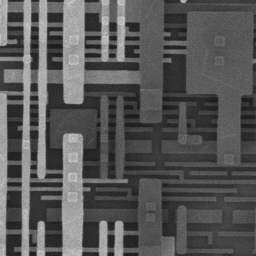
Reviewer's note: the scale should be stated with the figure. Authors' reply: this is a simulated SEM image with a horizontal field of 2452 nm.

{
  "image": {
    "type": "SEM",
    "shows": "wiring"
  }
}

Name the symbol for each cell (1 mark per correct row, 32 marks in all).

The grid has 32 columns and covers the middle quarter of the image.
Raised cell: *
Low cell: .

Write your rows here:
*****..............******......*
*****..............******......*
*****..............******......*
*****..............******......*
*****..............******......*
*****..............******......*
*****..............******......*
*****..............******.......
*****....**..**....******.......
****.....**..**....*****........
.........**..**....*****.....*..
.........**..**....*****.....*..
.........**..**....*****.....*..
.........**..**....*****.....*..
.........**..**....****......*..
.........**..**..............*..
.........**..**..............*..
.........**..**..............**.
*****....**..**..............***
*****....**..**..............***
*****....**..**.................
*****....**..**.................
****.....**..**.................
****.....**..**.................
****.....**..**.................
****.....**..**.................
****.....**..**.................
****.....**..**.................
****.....*...*..................
****...............*****........
****...............*****........
****...............*****........